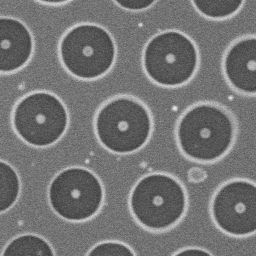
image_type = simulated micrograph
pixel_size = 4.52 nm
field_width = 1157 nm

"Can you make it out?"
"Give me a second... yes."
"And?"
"an array of small figures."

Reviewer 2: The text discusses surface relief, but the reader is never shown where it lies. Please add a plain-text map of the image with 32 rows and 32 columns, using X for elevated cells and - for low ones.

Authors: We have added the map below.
XXXXXXXXXXXXXXX----XXXXX------XX
XXXXXXXXXXXXXXXXXXXXXXXXX----XXX
--XXXXXXXXXXXXXXXXXXXXXXXXXXXXXX
---XXXXXX----XXXXXXXXXXXXXXXXXXX
----XXXX------XXXXXX---XXXXXXXXX
X---XXXX------XXXXX-----XXXXX---
----XXXX------XXXX-------XXX----
---XXXXX------XXXX-------XXX----
--XXXXXX------XXXX------XXXX----
XXXXXXXXXX--XXXXXXX-----XXXX----
XXXXXXXXXXXXXXXXXXXX---XXXXXX---
XXXXXXXXXXXXXXXXXXXXXXXXXXXXXX--
XXX----XXXXXXX---XXXXXXXXXXXXXXX
XX------XXXXX-----XXXXXX---XXXXX
XX------XXXX-------XXXX------XXX
XX------XXXX---X---XXX-------XXX
XX------XXXX-------XXX---X---XXX
XXX----XXXXX------XXXX-------XXX
XXXXXXXXXXXXX----XXXXXX------XXX
XXXXXXXXXXXXXXXXXXXXXXXX----XXXX
-XXXXXXXXXXXXXXXXXXXXXXXXXXXXXXX
--XXXXXX---XXXXXXXXXXXXXXXXXXXXX
--XXXXX-----XXXXXX----XXXXXXXXXX
--XXXX-------XXXX------XXXXX----
--XXXX-------XXX-------XXXX-----
--XXXX-------XXX-------XXXX-----
XXXXXXX-----XXXXX------XXXX-----
XXXXXXXXX-XXXXXXX-----XXXXX-----
XXXXXXXXXXXXXXXXXXX--XXXXXXX----
XXX-XXXXXXXXXXXXXXXXXXXXXXXXXXXX
X-----XXXXXXX--XXXXXXXXXXXXXXXXX
X------XXXX-----XXXXXX----XXXXXX